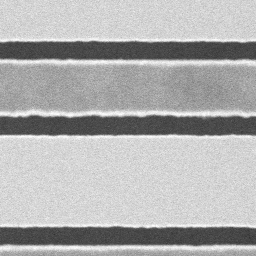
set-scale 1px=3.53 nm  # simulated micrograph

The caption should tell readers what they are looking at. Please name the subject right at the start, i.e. lines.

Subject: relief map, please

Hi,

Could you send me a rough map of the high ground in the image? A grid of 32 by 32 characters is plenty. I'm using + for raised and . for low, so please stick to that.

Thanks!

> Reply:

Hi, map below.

++++++++++++++++++++++++++++++++
++++++++++++++++++++++++++++++++
++++++++++++++++++++++++++++++++
++++++++++++++++++++++++++++++++
++++++++++++++++++++++++++++++++
................................
................................
++...++.+.....................+.
++++++++++++++++++++++++++++++++
++++++++++++++++++++++++++++++++
++++++++++++++++++++++++++++++++
++++++++++++++++++++++++++++++++
++++++++++++++++++++++++++++++++
++++++++++++++++++++++++++++++++
.++..++.++....++.+....++.++++.++
................................
................................
++++++++++++++++++++++++++++++++
++++++++++++++++++++++++++++++++
++++++++++++++++++++++++++++++++
++++++++++++++++++++++++++++++++
++++++++++++++++++++++++++++++++
++++++++++++++++++++++++++++++++
++++++++++++++++++++++++++++++++
++++++++++++++++++++++++++++++++
++++++++++++++++++++++++++++++++
++++++++++++++++++++++++++++++++
++++++++++++++++++++++++++++++++
................................
................................
................................
++++++++++++++++++++++++++++++++